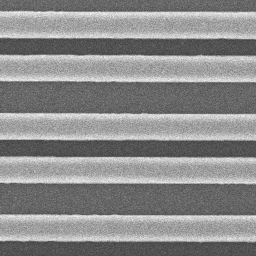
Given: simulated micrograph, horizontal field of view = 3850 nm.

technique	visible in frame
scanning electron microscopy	lines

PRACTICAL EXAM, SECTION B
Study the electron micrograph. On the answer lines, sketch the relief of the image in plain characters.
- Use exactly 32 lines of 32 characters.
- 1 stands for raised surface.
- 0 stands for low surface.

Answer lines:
00000000000000000000000000000000
00110000000000000000000000000000
11111111111111111111111111111111
11111111111111111111111111111111
11111111111111111111111111111111
00000000000000000000000000000000
00000000000000000000000000000000
11111111111111111111111111111111
11111111111111111111111111111111
11111111111111111111111111111111
00000000000000000000000000000000
00000000000000000000000000000000
00000000000000000000000000000000
00000000000000000000000000000000
11111111111111111111111111111111
11111111111111111111111111111111
11111111111111111111111111111111
00000111111101111111111111111111
00000000000000000000000000000000
00000000000000000000000000000000
11111111111111111111111111111111
11111111111111111111111111111111
11111111111111111111111111111111
00000000000000000000000000000000
00000000000000000000000000000000
00000000000000000000000000000000
00000000000000000000000000000000
11111111111111111111111111111111
11111111111111111111111111111111
11111111111111111111111111111111
00000000000000000000000000000000
00000000000000000000000000000000